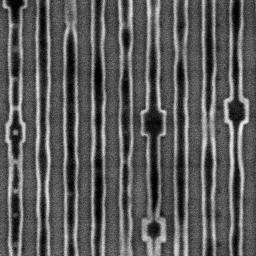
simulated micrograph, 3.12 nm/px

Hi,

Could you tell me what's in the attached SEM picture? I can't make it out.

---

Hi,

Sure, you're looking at wiring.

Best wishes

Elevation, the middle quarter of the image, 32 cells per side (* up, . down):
***....***.....**....***....**..
***....***....***....***....**..
***....***....***....***....**..
***....***....***....**.....***.
***....***....***....**.....***.
***....***....***....**.....***.
***....***....***....**.....***.
***....***....***....***....***.
***....***....***....***....***.
***....***....***....***....***.
***....***....***....***....***.
***....***....***...****....***.
***....***....***..******...***.
***....***....***..******...***.
***....***....***..******...***.
***....***....***..******...***.
***....***....***..******...***.
***....***....***..******...***.
***....***....***....***....***.
***....***....***....***....***.
***....***....***....***....***.
***....***....***....***....***.
***....***....***....***....***.
***....***.....*.....***....***.
***....***....**.....***....***.
***....***....**.....***....***.
***....***....***....***....***.
***....***....***....***....***.
***....***....***....***....***.
***....***....***....***....***.
***....***....**.....***....***.
***....***....**.....***....***.